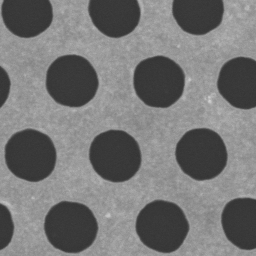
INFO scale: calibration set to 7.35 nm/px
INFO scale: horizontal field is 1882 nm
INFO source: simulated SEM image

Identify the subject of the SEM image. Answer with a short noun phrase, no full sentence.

holes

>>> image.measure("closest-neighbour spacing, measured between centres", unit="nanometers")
604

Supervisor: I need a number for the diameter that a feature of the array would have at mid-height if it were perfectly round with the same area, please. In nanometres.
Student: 384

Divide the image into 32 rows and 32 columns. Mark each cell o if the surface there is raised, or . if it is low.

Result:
......ooooo......ooooo......oooo
.......oooo.......oooo......oooo
.......oooo......ooooo......oooo
o.....oooooo.....oooooo....ooooo
oo..ooooooooo...oooooooooooooooo
oooooooooooooooooooooooooooooooo
oooooooooooooooooooooooooooooooo
ooooooo....ooooooo...oooooooo...
oooooo......ooooo......ooooo....
.ooooo......ooooo......oooo.....
.ooooo......ooooo......oooo.....
.ooooo......ooooo......oooo.....
.oooooo....ooooooo....oooooo....
oooooooooooooooooooooooooooooo..
oooooooooooooooooooooooooooooooo
oooooooooooooooooooooooooooooooo
oo...oooooooo...ooooooo....ooooo
o.....oooooo.....ooooo......oooo
o......oooo......ooooo......oooo
o......oooo.......oooo......oooo
o......oooo.......oooo......oooo
o.....oooooo.....oooooo.....oooo
ooo..oooooooo...ooooooooo.oooooo
oooooooooooooooooooooooooooooooo
oooooooooooooooooooooooooooooooo
ooooooo...oooooooo....oooooo....
.ooooo.....oooooo......ooooo....
..oooo......ooooo......ooooo....
..oooo......ooooo.......oooo....
..oooo......ooooo......ooooo....
.ooooo.....ooooooo.....oooooo...
oooooooo..oooooooooo.ooooooooooo